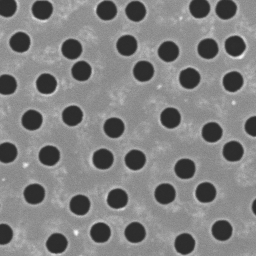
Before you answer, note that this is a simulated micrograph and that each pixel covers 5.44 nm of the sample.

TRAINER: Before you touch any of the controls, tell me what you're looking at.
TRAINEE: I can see a regular array of holes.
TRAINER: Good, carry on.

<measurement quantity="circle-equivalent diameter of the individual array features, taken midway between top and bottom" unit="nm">113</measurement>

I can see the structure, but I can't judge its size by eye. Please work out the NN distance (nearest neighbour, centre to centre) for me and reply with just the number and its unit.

33.9 pixels